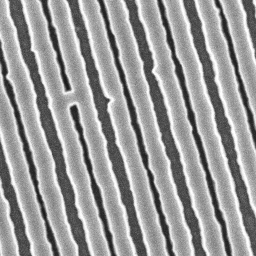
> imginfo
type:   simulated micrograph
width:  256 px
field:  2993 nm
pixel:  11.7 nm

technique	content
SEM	parallel lines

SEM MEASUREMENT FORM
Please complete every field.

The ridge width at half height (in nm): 213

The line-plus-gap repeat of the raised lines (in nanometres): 325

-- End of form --